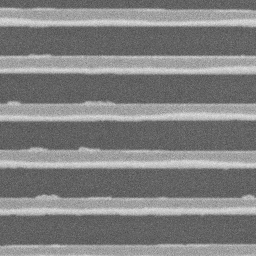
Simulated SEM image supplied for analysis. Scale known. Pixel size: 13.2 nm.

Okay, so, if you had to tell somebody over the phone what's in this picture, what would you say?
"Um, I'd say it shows lines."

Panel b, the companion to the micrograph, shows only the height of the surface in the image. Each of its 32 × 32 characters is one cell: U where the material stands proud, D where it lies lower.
DDDDDDDDDDDDDDDDDDDDDDDDDDDDDDDD
UUUUUUUUUUUUUUUUUUUUUUUUUUUUUUUU
UUUUUUUUUUUUUUUUUUUUUUUUUUUUUUUU
DDDDDDDDDDDDDDDDDDDDDDDDDDDDDDDD
DDDDDDDDDDDDDDDDDDDDDDDDDDDDDDDD
DDDDDDDDDDDDDDDDDDDDDDDDDDDDDDDD
DDDDDDDDDDDDDDDDDDDDDDDDDDDDDDDD
UUUUUUUUUUUUUUUUUUUUUUUUUUUUUUUU
UUUUUUUUUUUUUUUUUUUUUUUUUUUUUUUU
DDDDDDDDDDDDDDDDDDDDDDDDDDDDDDDD
DDDDDDDDDDDDDDDDDDDDDDDDDDDDDDDD
DDDDDDDDDDDDDDDDDDDDDDDDDDDDDDDD
DDDDDDDDDDDDDDDDDDDDDDDDDDDDDDDD
UUUUUUUUUUUUUUUUUUUUUUUUUUUUUUUU
UUUUUUUUUUUUUUUUUUUUUUUUUUUUUUUU
DDDDDDDDDDDDDDDDDDDDDDDDDDDDDDDD
DDDDDDDDDDDDDDDDDDDDDDDDDDDDDDDD
DDDDDDDDDDDDDDDDDDDDDDDDDDDDDDDD
DDDDDDDDDDDDDDDDDDDDDDDDDDDDDDDD
UUUUUUUUUUUUUUUUUUUUUUUUUUUUUUUU
UUUUUUUUUUUUUUUUUUUUUUUUUUUUUUUU
DDDDDDDDDDDDDDDDDDDDDDDDDDDDDDDD
DDDDDDDDDDDDDDDDDDDDDDDDDDDDDDDD
DDDDDDDDDDDDDDDDDDDDDDDDDDDDDDDD
DDDDDDDDDDDDDDDDDDDDDDDDDDDDDDDD
UUUUUUUUUUUUUUUUUUUUUUUUUUUUUUUU
UUUUUUUUUUUUUUUUUUUUUUUUUUUUUUDU
DDDDDDDDDDDDDDDDDDDDDDDDDDDDDDDD
DDDDDDDDDDDDDDDDDDDDDDDDDDDDDDDD
DDDDDDDDDDDDDDDDDDDDDDDDDDDDDDDD
DDDDDDDDDDDDDDDDDDDDDDDDDDDDDDDD
UUUUUUUUUUUUUUUUUUUUUUUUUUUUUUUU